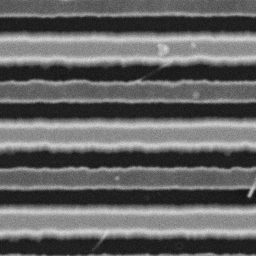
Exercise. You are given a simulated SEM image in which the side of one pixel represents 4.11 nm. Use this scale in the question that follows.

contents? lines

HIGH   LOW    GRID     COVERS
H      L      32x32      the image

HHHHHHHHHHHHHHHHHHHHHHHHHHHHHHHH
HHHHHHHHHHHHHHHHHHHHHHHHHHHHHHHH
LLLLLLLLLLLLLLLLLLLLLLLLLLLLLLLL
LLLLLLLLLLLLLLLLLLLLLLLLLLLLLLLL
HHHHHHHHHHHHHHHHHHHHHHHHHHHHHHHH
HHHHHHHHHHHHHHHHHHHHHHHHHHHHHHHH
HHHHHHHHHHHHHHHHHHHHHHHHHHHHHHHH
HHHHHHHHHHHHHHHHHHHHHHHHHHHHHHHH
LLLLLLLLLLLLLLLLLLLLLLLLLLLLLLLL
LLLLLLLLLLLLLLLLLLLLLLLLLLLLLLLL
HHHHHHHHHHHHHHHHHHHHHHHHHHHHHHHH
HHHHHHHHHHHHHHHHHHHHHHHHHHHHHHHH
HHHHHHHHHHHHHHHHHHHHHHHHHHHHHHHH
LLLLLLLLLLLLLLLLLLLLLLLLLLLLLLLL
LLLLLLLLLLLLLLLLLLLLLLLLLLLLLLLL
HHHHHHHHHHHHHHHHHHHHHHHHHHHHHHHH
HHHHHHHHHHHHHHHHHHHHHHHHHHHHHHHH
HHHHHHHHHHHHHHHHHHHHHHHHHHHHHHHH
HHHHHHHHHHHHHHHHHHHHHHHHHHHHHHHH
LLLLLLLLLLLLLLLLLLLLLLLLLLLLLLLL
LLLLLLLLLLLLLLLLLLLLLLLLLLLLLLLL
HHHHHHHHHHHHHHHHHHHHHHHHHHHHHHHH
HHHHHHHHHHHHHHHHHHHHHHHHHHHHHHHH
HHHHHHHHHHHHHHHHHHHHHHHHHHHHHHHH
LLLLLLLLLLLLLLLLLLLLLLLLLLLLLLLL
LLLLLLLLLLLLLLLLLLLLLLLLLLLLLLLL
HHHHHHHHHHHHHHHHHHHHHHHHHHHHHHHH
HHHHHHHHHHHHHHHHHHHHHHHHHHHHHHHH
HHHHHHHHHHHHHHHHHHHHHHHHHHHHHHHH
HHHHHHLHHHHLHHHHHLHHHHLHHHLHHHHH
LLLLLLLLLLLLLLLLLLLLLLLLLLLLLLLL
LLLLLLLLLLLLLLLLLLLLLLLLLLLLLLLL